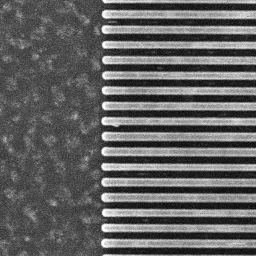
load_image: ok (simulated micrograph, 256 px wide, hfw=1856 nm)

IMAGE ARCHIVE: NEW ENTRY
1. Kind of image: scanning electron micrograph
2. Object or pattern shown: parallel lines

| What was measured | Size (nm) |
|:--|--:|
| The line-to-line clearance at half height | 58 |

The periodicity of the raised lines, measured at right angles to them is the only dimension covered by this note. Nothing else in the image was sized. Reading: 111 nm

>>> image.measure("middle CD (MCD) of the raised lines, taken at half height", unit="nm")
50.7